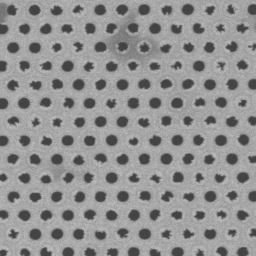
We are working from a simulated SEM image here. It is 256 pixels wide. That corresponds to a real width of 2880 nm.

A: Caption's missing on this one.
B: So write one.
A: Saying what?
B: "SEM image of a regular array of holes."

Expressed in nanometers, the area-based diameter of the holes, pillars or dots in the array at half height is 117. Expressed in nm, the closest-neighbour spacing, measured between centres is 236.